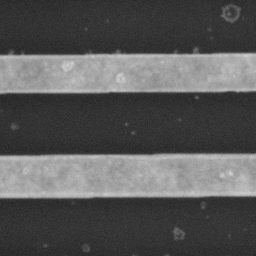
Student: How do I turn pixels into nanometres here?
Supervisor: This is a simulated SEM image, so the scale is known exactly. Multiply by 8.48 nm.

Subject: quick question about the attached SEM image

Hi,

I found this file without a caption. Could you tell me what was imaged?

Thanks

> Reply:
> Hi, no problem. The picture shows lines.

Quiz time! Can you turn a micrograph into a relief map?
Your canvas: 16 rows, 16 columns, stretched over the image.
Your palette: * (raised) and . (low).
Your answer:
................
................
................
****************
****************
****************
................
................
................
................
****************
****************
................
................
................
................